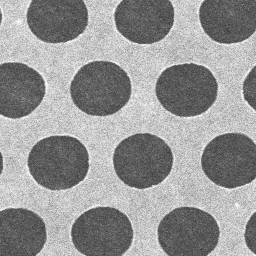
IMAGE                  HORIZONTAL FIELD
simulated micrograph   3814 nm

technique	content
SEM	holes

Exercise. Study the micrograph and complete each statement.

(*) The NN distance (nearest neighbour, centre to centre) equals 1.24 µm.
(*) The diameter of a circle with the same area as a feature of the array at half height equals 871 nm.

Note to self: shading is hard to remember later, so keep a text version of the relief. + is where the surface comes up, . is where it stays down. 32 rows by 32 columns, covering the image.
++++.......++++......++++.......
+++........+++........+++.......
+++........+++........+++.......
++++.......++++......++++.......
++++......+++++......+++++.....+
++++++++++++++++++++++++++++.+++
++++++++++++++++++++++++++++++++
++++++++++++++++++++++++++++++++
....++++++.....++++++.....++++++
.....++++.......++++.......++++.
......+++.......+++........+++..
......+++.......++++.......+++..
.....++++.......++++.......++++.
.....+++++.....+++++......++++++
...+++++++++++++++++++..++++++++
++++++++++++++++++++++++++++++++
++++++++++++++++++++++++++++++++
+++++.....+++++.....++++++.....+
++++.......+++.......+++++......
++++.......+++........+++.......
+++........+++........+++.......
++++.......+++.......++++.......
++++......+++++......+++++......
++++++...++++++++.++++++++++.+++
++++++++++++++++++++++++++++++++
++++++++++++++++++++++++++++++++
....+++++++....++++++.....++++++
.....++++.......++++.......++++.
......+++........+++.......++++.
......+++........+++.......+++..
......+++.......++++.......++++.
.....+++++......+++++.....+++++.